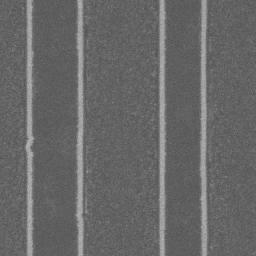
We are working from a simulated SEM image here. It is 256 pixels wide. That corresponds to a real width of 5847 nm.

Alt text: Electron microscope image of one or a few lines or trenches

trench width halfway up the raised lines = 1850 nm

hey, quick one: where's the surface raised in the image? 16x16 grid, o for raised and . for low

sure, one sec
..ooo.....ooo...
..ooo.....ooo...
..ooo.....ooo...
..ooo.....ooo...
..ooo.....ooo...
..ooo.....ooo...
..ooo.....ooo...
..ooo.....ooo...
..ooo.....ooo...
..ooo.....ooo...
..ooo.....ooo...
..ooo.....ooo...
..ooo.....ooo...
..ooo.....ooo...
..ooo.....ooo...
..ooo.....ooo...